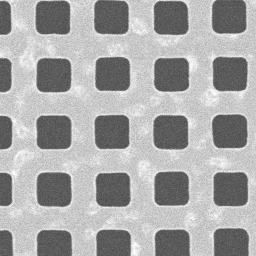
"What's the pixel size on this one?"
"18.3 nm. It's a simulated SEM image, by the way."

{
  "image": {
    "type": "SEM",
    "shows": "a regular array of holes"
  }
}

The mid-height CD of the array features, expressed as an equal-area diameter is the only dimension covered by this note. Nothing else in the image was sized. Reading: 38.1 pixels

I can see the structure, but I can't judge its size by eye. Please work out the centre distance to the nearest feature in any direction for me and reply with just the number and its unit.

1040 nm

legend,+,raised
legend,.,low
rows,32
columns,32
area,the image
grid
.++++....+++....+++....++++....+
.+++.....+++....+++.....++.....+
.+++.....+++....+++.....++.....+
.+++.....+++....+++.....+++....+
++++++++++++++++++++++++++++++++
++++++++++++++++++++++++++++++++
++++++++++++++++++++++++++++++++
.++++....+++....++++...++++....+
..++.....+++....+++.....+++....+
..++.....+++....+++.....+++....+
.+++.....+++....+++.....+++....+
.++++...+++++++++++++.++++++..++
++++++++++++++++++++++++++++++++
++++++++++++++++++++++++++++++++
.++++...++++....++++...++++...++
..+++....+++....+++....+++.....+
..+++....+++....+++.....++.....+
..+++....+++....+++.....+++....+
.++++...++++....++++...++++...++
++++++++++++++++++++++++++++++++
++++++++++++++++++++++++++++++++
++++++..++++++++++++...+++++..++
.++++....+++....+++.....+++....+
..+++....+++....+++.....+++....+
..+++....+++....+++.....+++....+
.++++....+++....++++...++++....+
++++++++++++++++++++++++++++++++
++++++++++++++++++++++++++++++++
++++++++++++++++++++++++++++..++
..+++....+++....+++.....+++....+
..+++....+++....+++.....+++....+
..+++....+++....+++.....+++....+